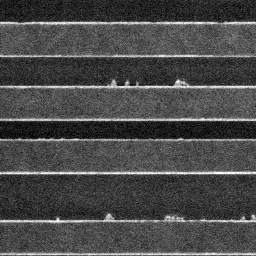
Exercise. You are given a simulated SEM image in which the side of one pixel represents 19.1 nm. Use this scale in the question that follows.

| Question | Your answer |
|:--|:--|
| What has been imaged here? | lines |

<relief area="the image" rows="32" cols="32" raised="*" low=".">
................................
................................
................................
********************************
********************************
********************************
********************************
................................
................................
................................
................................
********************************
********************************
********************************
********************************
................................
................................
********************************
********************************
********************************
********************************
********************************
................................
................................
................................
................................
................................
................................
********************************
********************************
********************************
********************************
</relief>